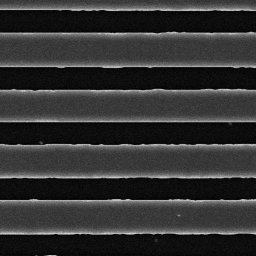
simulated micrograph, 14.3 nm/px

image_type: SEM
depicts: lines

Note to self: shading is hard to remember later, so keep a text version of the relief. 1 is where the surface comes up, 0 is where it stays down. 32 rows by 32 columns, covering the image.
11111111111111111111111111111111
00000000000000000000000000000000
00000000000000000000000000000000
00000000000000000000000000000000
11111111111111111111111111111111
11111111111111111111111111111111
11111111111111111111111111111111
11111111111111111111111111111111
00000000000000000000000000000000
00000000000000000000000000000000
00000000000000000000000000000000
11111111111111111111111111111111
11111111111111111111111111111111
11111111111111111111111111111111
11111111111111111111111111111111
00000000000000000000000000000000
00000000000000000000000000000000
00000000000000000000000000000000
11111111111111111111111111111111
11111111111111111111111111111111
11111111111111111111111111111111
11111111111111111111111111111111
00000000000000000000000000000000
00000000000000000000000000000000
00000000000000000000000000000000
11111111111111111111111111111111
11111111111111111111111111111111
11111111111111111111111111111111
11111111111111111111111111111111
00000000000000000000000000000000
00000000000000000000000000000000
00000000000000000000000000000000